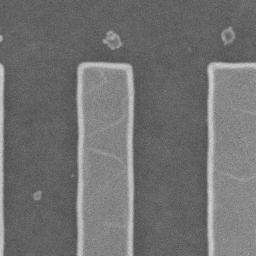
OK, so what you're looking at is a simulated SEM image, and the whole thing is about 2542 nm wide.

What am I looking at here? wiring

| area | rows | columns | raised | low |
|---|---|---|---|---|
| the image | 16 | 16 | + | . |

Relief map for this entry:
................
................
................
................
.....+++.....+++
.....+++.....+++
.....+++.....+++
.....+++.....+++
.....+++.....+++
.....+++.....+++
.....+++.....+++
.....+++.....+++
.....+++.....+++
.....+++.....+++
.....+++.....+++
.....+++.....+++